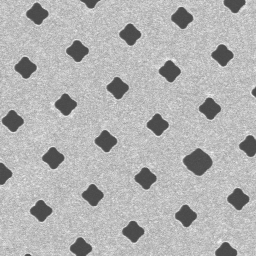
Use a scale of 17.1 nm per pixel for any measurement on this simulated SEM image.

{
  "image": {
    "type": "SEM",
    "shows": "a regular array of holes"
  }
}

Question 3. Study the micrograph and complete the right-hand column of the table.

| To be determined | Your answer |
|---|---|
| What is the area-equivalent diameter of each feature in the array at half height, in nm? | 334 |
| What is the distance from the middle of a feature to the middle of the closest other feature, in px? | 54.4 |